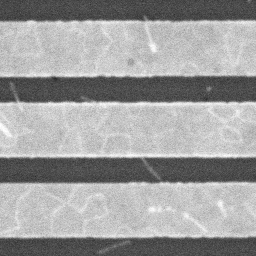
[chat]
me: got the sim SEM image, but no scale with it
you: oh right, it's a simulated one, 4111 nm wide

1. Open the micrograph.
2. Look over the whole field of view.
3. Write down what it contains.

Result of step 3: lines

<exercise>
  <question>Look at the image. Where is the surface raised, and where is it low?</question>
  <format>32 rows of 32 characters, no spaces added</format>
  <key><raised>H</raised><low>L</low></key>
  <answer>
LLLLLLLLLLLLLLLLLLLLLLLLLLLLLLLL
LLLLLLLLLLLLLLLLLLLLLLLLLLLLLLLL
LLLLLLLLLLLLLLLLLLLLLLLLLLLLLLLL
HHHHHHHHHHHHHHHHHHHHHHHHHHHHHHHH
HHHHHHHHHHHHHHHHHHHHHHHHHHHHHHHH
HHHHHHHHHHHHHHHHHHHHHHHHHHHHHHHH
HHHHHHHHHHHHHHHHHHHHHHHHHHHHHHHH
HHHHHHHHHHHHHHHHHHHHHHHHHHHHHHHH
HHHHHHHHHHHHHHHHHHHHHHHHHHHHHHHH
LLLLLLLLLLLLLLLLLLLLLLLLLLLLLLLL
LLLLLLLLLLLLLLLLLLLLLLLLLLLLLLLL
LLLLLLLLLLLLLLLLLLLLLLLLLLLLLLLL
LLLLLLLLLLLLLLLLLLLLLLLLLLLLLLLL
HHHHHHHHHHHHHHHHHHHHHHHHHHHHHHHH
HHHHHHHHHHHHHHHHHHHHHHHHHHHHHHHH
HHHHHHHHHHHHHHHHHHHHHHHHHHHHHHHH
HHHHHHHHHHHHHHHHHHHHHHHHHHHHHHHH
HHHHHHHHHHHHHHHHHHHHHHHHHHHHHHHH
HHHHHHHHHHHHHHHHHHHHHHHHHHHHHHHH
HHHHHHHHHHHLHHHHHHHHHHHHHHHHHHHH
LLLLLLLLLLLLLLLLLLLLLLLLLLLLLLLL
LLLLLLLLLLLLLLLLLLLLLLLLLLLLLLLL
LLLLLLLLLLLLLLLLLLLLLLLLLLLLLLLL
HHHHHHHHHHHHHHHHHHHHHHHHHHHHHHHH
HHHHHHHHHHHHHHHHHHHHHHHHHHHHHHHH
HHHHHHHHHHHHHHHHHHHHHHHHHHHHHHHH
HHHHHHHHHHHHHHHHHHHHHHHHHHHHHHHH
HHHHHHHHHHHHHHHHHHHHHHHHHHHHHHHH
HHHHHHHHHHHHHHHHHHHHHHHHHHHHHHHH
HHHHHHHHHHHHHHHHHHHLLHHHHHHHHHHL
LLLLLLLLLLLLLLLLLLLLLLLLLLLLLLLL
LLLLLLLLLLLLLLLLLLLLLLLLLLLLLLLL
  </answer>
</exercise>